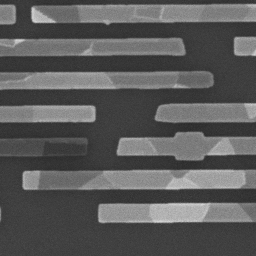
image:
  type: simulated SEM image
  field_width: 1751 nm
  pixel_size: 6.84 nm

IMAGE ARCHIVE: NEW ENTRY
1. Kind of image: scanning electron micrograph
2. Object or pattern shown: wiring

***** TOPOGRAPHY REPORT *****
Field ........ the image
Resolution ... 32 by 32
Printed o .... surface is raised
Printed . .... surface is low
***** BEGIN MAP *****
................................
oo..oooooooooooooooooooooooooooo
oo..oooooooooooooooooooooooooooo
................................
................................
ooooooooooooooooooooooo......ooo
ooooooooooooooooooooooo......ooo
................................
................................
oooooooooooooooooooooooooo......
oooooooooooooooooooooooooo......
................................
................................
oooooooooooo........oooooooooooo
oooooooooooo.......ooooooooooooo
................................
................................
ooooooooooo....ooooooooooooooooo
ooooooooooo....ooooooooooooooooo
.....................ooooo......
................................
....oooo.ooooooooooooooooooooooo
...ooooooooooooooooooooooooooooo
...ooooooooooooooooooooooooooooo
................................
..........................oooooo
............oooooooooooooooooooo
............oooooooooooooooooooo
................................
................................
................................
................................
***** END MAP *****